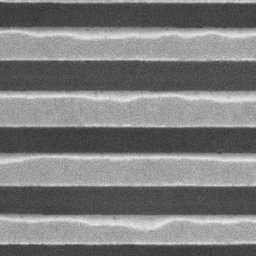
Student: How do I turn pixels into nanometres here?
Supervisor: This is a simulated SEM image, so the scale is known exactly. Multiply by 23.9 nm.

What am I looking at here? lines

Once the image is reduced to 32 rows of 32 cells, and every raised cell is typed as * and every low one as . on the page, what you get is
................................
................................
................................
................................
********************************
********************************
********************************
................................
................................
................................
................................
................................
********************************
********************************
********************************
********************************
................................
................................
................................
...*************************....
********************************
********************************
********************************
................................
................................
................................
................................
******************.*************
********************************
********************************
................................
................................